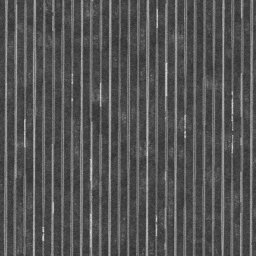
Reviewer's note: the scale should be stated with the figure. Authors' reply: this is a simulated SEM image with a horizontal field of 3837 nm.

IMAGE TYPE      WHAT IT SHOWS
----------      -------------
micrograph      parallel lines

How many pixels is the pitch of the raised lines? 9.44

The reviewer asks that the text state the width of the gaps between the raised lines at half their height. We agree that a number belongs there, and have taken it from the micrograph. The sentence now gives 122 nm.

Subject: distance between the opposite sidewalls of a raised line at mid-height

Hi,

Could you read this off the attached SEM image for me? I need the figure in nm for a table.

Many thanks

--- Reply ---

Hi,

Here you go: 22.5